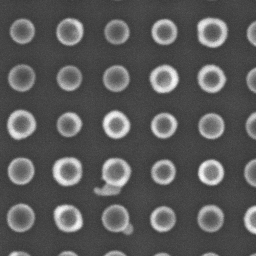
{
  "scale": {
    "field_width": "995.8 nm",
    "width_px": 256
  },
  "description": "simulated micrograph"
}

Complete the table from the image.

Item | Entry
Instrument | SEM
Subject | a regular array of raised bodies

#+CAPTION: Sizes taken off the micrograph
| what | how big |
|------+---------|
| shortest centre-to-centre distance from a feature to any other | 181 nm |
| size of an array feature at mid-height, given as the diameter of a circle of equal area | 99.2 nanometers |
